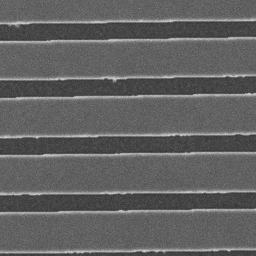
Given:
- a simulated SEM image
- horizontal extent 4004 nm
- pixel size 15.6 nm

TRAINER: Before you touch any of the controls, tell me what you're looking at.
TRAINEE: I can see lines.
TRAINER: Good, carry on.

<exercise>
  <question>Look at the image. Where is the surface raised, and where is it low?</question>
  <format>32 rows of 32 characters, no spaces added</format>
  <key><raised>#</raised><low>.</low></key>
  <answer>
################################
################################
################################
................................
................................
################################
################################
################################
################################
###############################.
................................
................................
################################
################################
################################
################################
################################
................................
................................
################################
################################
################################
################################
################################
................................
................................
.......#########################
################################
################################
################################
################################
############....................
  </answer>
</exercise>